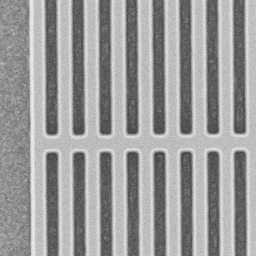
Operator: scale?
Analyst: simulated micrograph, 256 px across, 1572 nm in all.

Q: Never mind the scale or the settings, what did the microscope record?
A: groups of lines, slits or small figures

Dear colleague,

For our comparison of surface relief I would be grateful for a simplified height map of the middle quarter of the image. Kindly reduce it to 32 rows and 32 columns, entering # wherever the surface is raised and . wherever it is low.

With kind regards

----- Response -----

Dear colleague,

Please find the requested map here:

##...####...###....###...####...
##...####...###....###...####...
##...####...###....###....###...
##...####...###....###....###...
##...####...###....###....###...
##...####...###....###....###...
##...####...###....###....###...
##...####...###....###....###...
##...####...###....###....###...
##...####...###....###....###...
##...####...###....###....###...
##...####...###....###....###...
##...####...###....###....###...
##...####...###....###....###...
##...####...###....###....###...
##...####...###....###....###...
##...####...###....###....###...
##...####...####..#####..#####.#
################################
################################
################################
################################
##...####...####...###...####...
##....###...###....###....###...
##....###...###....###....###...
##....###...###....###....###...
##....###...###....###....###...
##....###...####...###....###...
##....###...####...###....###...
##....###...###....###....###...
##....###...###....###....###...
##....###...###....###....###...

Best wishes